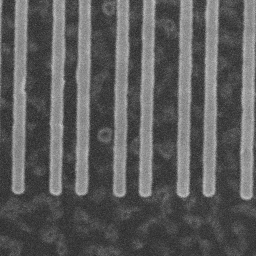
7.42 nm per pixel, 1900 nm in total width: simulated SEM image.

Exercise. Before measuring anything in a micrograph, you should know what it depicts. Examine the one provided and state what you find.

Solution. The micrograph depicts parallel lines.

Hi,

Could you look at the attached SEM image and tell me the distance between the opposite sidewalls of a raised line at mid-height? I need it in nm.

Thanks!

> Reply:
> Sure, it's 82.6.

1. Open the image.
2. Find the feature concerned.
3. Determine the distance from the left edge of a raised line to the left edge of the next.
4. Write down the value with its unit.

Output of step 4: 242 nanometers